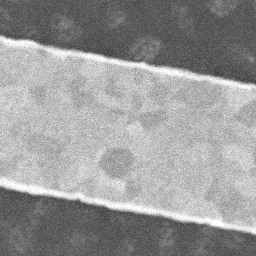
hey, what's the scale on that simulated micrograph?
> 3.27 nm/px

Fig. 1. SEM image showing one or a few lines or trenches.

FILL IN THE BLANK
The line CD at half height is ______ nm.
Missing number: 462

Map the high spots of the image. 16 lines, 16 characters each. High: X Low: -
----------------
----------------
----------------
XXXXXX----------
XXXXXXXXXXX-----
XXXXXXXXXXXXXXXX
XXXXXXXXXXXXXXXX
XXXXXXXXXXXXXXXX
XXXXXXXXXXXXXXXX
XXXXXXXXXXXXXXXX
XXXXXXXXXXXXXXXX
XXXXXXXXXXXXXXXX
------XXXXXXXXXX
-----------XXXXX
----------------
----------------